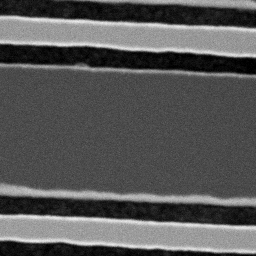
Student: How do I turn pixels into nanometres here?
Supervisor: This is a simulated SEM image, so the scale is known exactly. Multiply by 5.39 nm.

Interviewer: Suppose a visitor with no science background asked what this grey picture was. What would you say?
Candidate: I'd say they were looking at lines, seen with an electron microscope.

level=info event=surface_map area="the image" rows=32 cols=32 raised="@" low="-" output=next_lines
---------------------------@@@@@
--------------------------------
@@@@@@@@------------------------
@@@@@@@@@@@@@@@@@@@@@@@@@@@@@@--
@@@@@@@@@@@@@@@@@@@@@@@@@@@@@@@@
-@@@@@@@@@@@@@@@@@@@@@@@@@@@@@@@
----------------------@@@@@@@@@@
--------------------------------
@@@@@@@@@@@---------------------
@@@@@@@@@@@@@@@@@@@@@@@@@@@@@@@@
@@@@@@@@@@@@@@@@@@@@@@@@@@@@@@@@
@@@@@@@@@@@@@@@@@@@@@@@@@@@@@@@@
@@@@@@@@@@@@@@@@@@@@@@@@@@@@@@@@
@@@@@@@@@@@@@@@@@@@@@@@@@@@@@@@@
@@@@@@@@@@@@@@@@@@@@@@@@@@@@@@@@
@@@@@@@@@@@@@@@@@@@@@@@@@@@@@@@@
@@@@@@@@@@@@@@@@@@@@@@@@@@@@@@@@
@@@@@@@@@@@@@@@@@@@@@@@@@@@@@@@@
@@@@@@@@@@@@@@@@@@@@@@@@@@@@@@@@
@@@@@@@@@@@@@@@@@@@@@@@@@@@@@@@@
@@@@@@@@@@@@@@@@@@@@@@@@@@@@@@@@
@@@@@@@@@@@@@@@@@@@@@@@@@@@@@@@@
@@@@@@@@@@@@@@@@@@@@@@@@@@@@@@@@
@@@@@@@@@@@@@@@@@@@@@@@@@@@@@@@@
-------@@@@@@@@@@@@@@@@@@@@@@@@@
----------------------------@-@@
--------------------------------
@@@@@@@@@@@@@@@-----------------
@@@@@@@@@@@@@@@@@@@@@@@@@@@@@@@@
@@@@@@@@@@@@@@@@@@@@@@@@@@@@@@@@
---------@@@@@@@@@@@@@@@@@@@@@@@
--------------------------@@@@@@